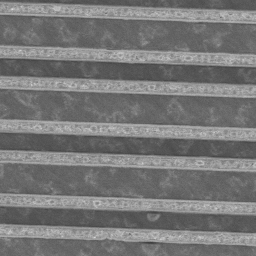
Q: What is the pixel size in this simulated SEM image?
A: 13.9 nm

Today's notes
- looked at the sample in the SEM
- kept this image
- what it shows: parallel lines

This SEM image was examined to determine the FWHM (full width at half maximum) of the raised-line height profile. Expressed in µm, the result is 0.154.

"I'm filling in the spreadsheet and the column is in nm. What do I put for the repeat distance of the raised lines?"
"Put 512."